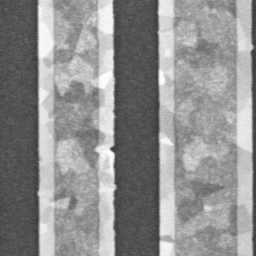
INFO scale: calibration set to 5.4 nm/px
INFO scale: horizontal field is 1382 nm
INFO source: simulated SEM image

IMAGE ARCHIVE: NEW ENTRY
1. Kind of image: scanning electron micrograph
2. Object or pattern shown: one or a few lines or trenches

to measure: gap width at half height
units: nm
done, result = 310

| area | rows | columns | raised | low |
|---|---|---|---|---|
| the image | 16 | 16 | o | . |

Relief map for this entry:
...oooo...ooooo.
...oooo...ooooo.
...oooo...ooooo.
...oooo...ooooo.
...oooo...ooooo.
...oooo...ooooo.
...oooo...ooooo.
...oooo...ooooo.
...oooo...ooooo.
...oooo...ooooo.
...oooo...ooooo.
...oooo...ooooo.
...oooo...ooooo.
...oooo...ooooo.
...oooo...ooooo.
...oooo...ooooo.